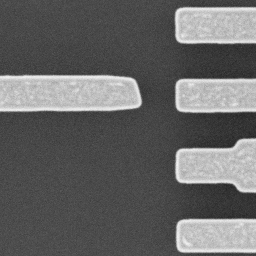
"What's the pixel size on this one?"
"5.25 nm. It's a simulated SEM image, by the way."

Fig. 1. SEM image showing wiring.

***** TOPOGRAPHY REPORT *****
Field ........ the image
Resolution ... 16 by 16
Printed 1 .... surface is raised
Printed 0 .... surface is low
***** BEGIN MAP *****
0000000000000000
0000000000011111
0000000000011111
0000000000000000
0000000000000000
1111111110011111
1111111110011111
0000000000000000
0000000000000000
0000000000011111
0000000000011111
0000000000000011
0000000000000000
0000000000000000
0000000000011111
0000000000011111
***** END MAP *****